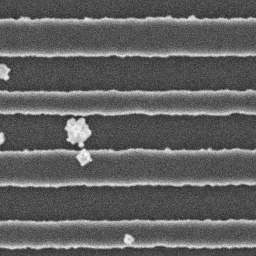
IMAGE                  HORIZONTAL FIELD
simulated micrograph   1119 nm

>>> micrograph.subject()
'lines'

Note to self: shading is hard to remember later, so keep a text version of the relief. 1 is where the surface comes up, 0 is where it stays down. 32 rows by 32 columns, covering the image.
00000000000000000000000000000000
00000000000000000000000000000000
11101111111111111111111111111111
11111111111111111111111111111111
11111111111111111111111111111111
11111111111111111111111111111111
11111111111111111111111111111111
00000000000000000000000000000000
00000000000000000000000000000000
00000000000000000000000000000000
00000000000000000000000000000000
11111111111111111111111111111111
11111111111111111111111111111111
11111111111111111111111111111111
00000000000000000000000000000000
00000000000000000000000000000000
00000000010000000000000000000000
00000000000000000000000000000000
00000000000000000000000000000000
11111111111111111111111111111111
11111111111111111111111111111111
11111111111111111111111111111111
11111111111111111111111111111111
00000000000000000000000000000000
00000000000000000000000000000000
00000000000000000000000000000000
00000000000000000000000000000000
00000000000000000100000100000110
11111111111111111111111111111111
11111111111111111111111111111111
11111111111111111111111111111111
00000000000000000000000000000000